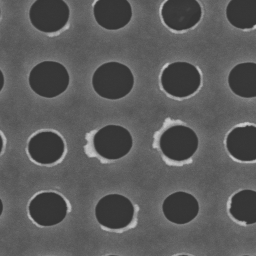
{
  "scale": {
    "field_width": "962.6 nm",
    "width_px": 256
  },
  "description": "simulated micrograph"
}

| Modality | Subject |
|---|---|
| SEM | a regular array of holes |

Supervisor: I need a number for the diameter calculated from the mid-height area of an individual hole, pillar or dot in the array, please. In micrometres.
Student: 0.137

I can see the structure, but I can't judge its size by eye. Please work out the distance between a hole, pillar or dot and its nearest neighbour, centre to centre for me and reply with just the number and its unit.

63.5 px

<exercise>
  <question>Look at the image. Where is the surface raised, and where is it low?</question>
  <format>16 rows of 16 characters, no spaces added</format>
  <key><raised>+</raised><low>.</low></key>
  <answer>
++..++..++..++..
++..++..++..+++.
++++++++++++++++
++++++++++++++++
++..++..++..++..
++..++..++..++..
++++++++++++++++
++++++++++++++++
++..++..++..++..
++..++..++..++..
++++++++++++++++
++++++++++++++++
++..++..++..++..
++..++..++..+++.
++++++++++++++++
++++++++++++++++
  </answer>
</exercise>